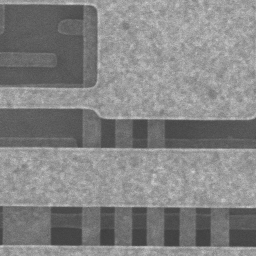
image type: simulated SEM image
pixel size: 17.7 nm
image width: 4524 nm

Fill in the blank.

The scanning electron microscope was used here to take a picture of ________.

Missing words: wiring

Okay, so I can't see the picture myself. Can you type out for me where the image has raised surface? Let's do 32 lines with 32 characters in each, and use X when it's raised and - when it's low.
----------XXXXXXXXXXXXXXXXXXXXXX
----------XXXXXXXXXXXXXXXXXXXXXX
----------XXXXXXXXXXXXXXXXXXXXXX
----------XXXXXXXXXXXXXXXXXXXXXX
----------XXXXXXXXXXXXXXXXXXXXXX
----------XXXXXXXXXXXXXXXXXXXXXX
----------XXXXXXXXXXXXXXXXXXXXXX
----------XXXXXXXXXXXXXXXXXXXXXX
----------XXXXXXXXXXXXXXXXXXXXXX
----------XXXXXXXXXXXXXXXXXXXXXX
----------XXXXXXXXXXXXXXXXXXXXXX
XXXXXXXXXXXXXXXXXXXXXXXXXXXXXXXX
XXXXXXXXXXXXXXXXXXXXXXXXXXXXXXXX
----------XXXXXXXXXXXXXXXXXXXXXX
----------XXXXXXXXXXXXXXXXXXXXXX
----------XXX-XXX--XX-----------
----------XXX-XXX--XX-----------
----------XXX-XXX--XX-----------
XXXXXXXX--XXX-XXX-XXX-----------
XXXXXXXXXXXXXXXXXXXXXXXXXXXXXXXX
XXXXXXXXXXXXXXXXXXXXXXXXXXXXXXXX
XXXXXXXXXXXXXXXXXXXXXXXXXXXXXXXX
XXXXXXXXXXXXXXXXXXXXXXXXXXXXXXXX
XXXXXXXXXXXXXXXXXXXXXXXXXXXXXXXX
XXXXXXXXXXXXXXXXXXXXXXXXXXXXXXXX
XXXXXXXXXXXXXXXXXXXXXXXXXXXXXXXX
XXXXXX----XX--XX--XX---X--XXX---
XXXXXX----XX--XX--XX---X--XX----
XXXXXX----XX--XX--XX---X--XX----
XXXXXX----XX--XX--XX---X--XXX---
XXXXXXX---XXX-XXX-XXX-XX--XXX---
XXXXXXXXXXXXXXXXXXXXXXXXXXXXXXXX